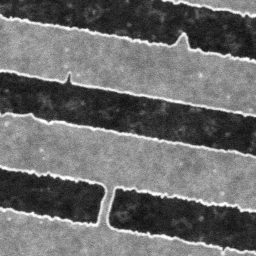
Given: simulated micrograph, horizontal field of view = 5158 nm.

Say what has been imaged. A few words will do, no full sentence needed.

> one or a few lines or trenches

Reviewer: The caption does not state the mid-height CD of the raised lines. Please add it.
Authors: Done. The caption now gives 1090 nanometers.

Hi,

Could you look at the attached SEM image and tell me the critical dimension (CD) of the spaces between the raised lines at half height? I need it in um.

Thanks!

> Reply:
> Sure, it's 0.821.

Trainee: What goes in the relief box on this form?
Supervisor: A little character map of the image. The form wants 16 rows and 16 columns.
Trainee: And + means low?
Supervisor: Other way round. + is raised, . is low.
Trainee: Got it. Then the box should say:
.............+++
+++.............
++++++++...+....
++++++++++++++..
.+++++++++++++++
......++++++++++
............++++
+++.............
+++++++++.......
+++++++++++++++.
++++++++++++++++
......++++++++++
......+.....++++
+++...+.........
++++++++........
++++++++++++++..